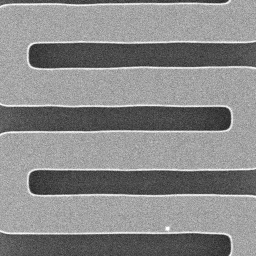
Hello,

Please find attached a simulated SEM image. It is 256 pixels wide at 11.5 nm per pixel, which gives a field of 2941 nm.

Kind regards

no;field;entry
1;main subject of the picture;groups of lines, slits or small figures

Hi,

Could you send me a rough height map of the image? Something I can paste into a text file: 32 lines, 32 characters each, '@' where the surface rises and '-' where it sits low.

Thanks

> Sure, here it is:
---------------------@@@@@--@@@@
@@@@@@@@@@@@@@@@@@@@@@@@@@@@@@@@
@@@@@@@@@@@@@@@@@@@@@@@@@@@@@@@@
@@@@@@@@@@@@@@@@@@@@@@@@@@@@@@@@
@@@@@@@@@@@@@@@@@@@@@@@@@@@@@@@@
@@@@----------------------------
@@@@----------------------------
@@@@----------------------------
@@@@@----------@@@@@@@@@@@@@@@@@
@@@@@@@@@@@@@@@@@@@@@@@@@@@@@@@@
@@@@@@@@@@@@@@@@@@@@@@@@@@@@@@@@
@@@@@@@@@@@@@@@@@@@@@@@@@@@@@@@@
@@@@@@@@@@@@@@@@@@@@@@@@@@@@@@@@
----------------------------@@@@
-----------------------------@@@
-----------------------------@@@
------------@@@@@@@@@@@@@@@@@@@@
@@@@@@@@@@@@@@@@@@@@@@@@@@@@@@@@
@@@@@@@@@@@@@@@@@@@@@@@@@@@@@@@@
@@@@@@@@@@@@@@@@@@@@@@@@@@@@@@@@
@@@@@@@@@@@@@@@@@@@@@@@@@@@@@@@@
@@@@----------------------------
@@@-----------------------------
@@@@----------------------------
@@@@@@@@@@@@@@@@@@@@@@@@@@@@@@@@
@@@@@@@@@@@@@@@@@@@@@@@@@@@@@@@@
@@@@@@@@@@@@@@@@@@@@@@@@@@@@@@@@
@@@@@@@@@@@@@@@@@@@@@@@@@@@@@@@@
@@@@@@@@@@@@@@@@@@@@@@@@@@@@@@@@
----------------------------@@@@
-----------------------------@@@
-----------------------------@@@